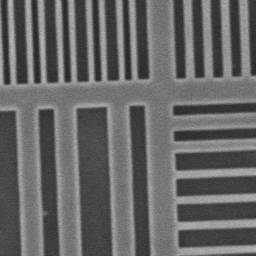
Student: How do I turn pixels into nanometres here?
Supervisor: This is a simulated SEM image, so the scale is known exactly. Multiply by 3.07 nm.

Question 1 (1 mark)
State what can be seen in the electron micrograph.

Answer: groups of lines, slits or small figures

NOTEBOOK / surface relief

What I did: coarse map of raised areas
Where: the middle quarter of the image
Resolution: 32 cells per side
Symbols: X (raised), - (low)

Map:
--X---XX-XX---X--X---XXXXXXX--XX
--X---XX-XX---X--X---XXXXXXX--XX
--X---XX-XX---X--X---XXXXXXX---X
--X---XX-XX---X--XX--XXXXXXX--XX
-XXX--XXXXXXXXXXXXXXXXXXXXXXXXXX
XXXXXXXXXXXXXXXXXXXXXXXXXXXXXXXX
XXXXXXXXXXXXXXXXXXXXXXXXXXXXXXXX
XXXXXXXXXXXXXXXXXXXXXXXXXXXXXXXX
XXXXXXXXXXXXXXXXXXXXXXXXXXXXXXXX
XXXXXXXXXXXXXXXXXXXXXXXXXXXXXXXX
XXXXXXXXXXXXXXXXX---XXXXXXXX----
XXX--------XXXXX----XXXXXXX-----
XXX--------XXXXX----XXXXXXX-----
XXX--------XXXXX----XXXXXXXXXXXX
XXX--------XXXXX----XXXXXXXXXXXX
XXX--------XXXXX----XXXXXXXXXXXX
XXX--------XXXXXX---XXXXXXXXXXXX
XXX--------XXXXXX---XXXXXXX-----
XXX--------XXXXXX----XXXXXX-----
XXX--------XXXXXX----XXXXXXXXXXX
XXX--------XXXXXX----XXXXXXXXXXX
XXX--------XXXXXX----XXXXXXXXXXX
XXX--------XXXXXX----XXXXXXX----
XXX--------XXXXXX----XXXXXXX----
XXX--------XXXXXX----XXXXXXX----
XXX--------XXXXXX----XXXXXXX----
XXXX-------XXXXXX----XXXXXXX----
XXXX-------XXXXXX----XXXXXXXXXXX
XXXX--------XXXXX----XXXXXXXXXX-
XXXX--------XXXXX----XXXXXXX----
XXXX--------XXXXX----XXXXXXX----
XXXX--------XXXXX----XXXXXXX----